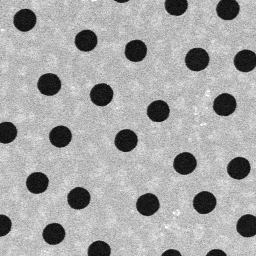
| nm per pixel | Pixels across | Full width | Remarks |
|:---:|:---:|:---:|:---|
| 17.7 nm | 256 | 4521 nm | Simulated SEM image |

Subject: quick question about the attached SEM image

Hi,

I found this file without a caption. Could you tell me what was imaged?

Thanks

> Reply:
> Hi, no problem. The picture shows a regular array of holes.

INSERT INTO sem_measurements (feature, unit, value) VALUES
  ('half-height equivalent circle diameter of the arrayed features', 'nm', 408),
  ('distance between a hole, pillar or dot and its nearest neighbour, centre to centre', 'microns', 0.896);